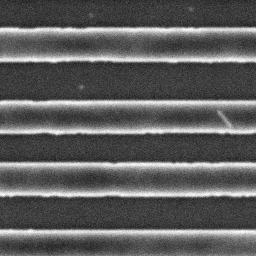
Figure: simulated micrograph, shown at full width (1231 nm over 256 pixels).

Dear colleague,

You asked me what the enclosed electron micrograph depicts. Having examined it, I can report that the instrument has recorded lines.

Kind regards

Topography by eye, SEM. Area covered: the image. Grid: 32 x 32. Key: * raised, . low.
................................
................................
................................
................................
********************************
********************************
********************************
*********..*.*******************
................................
................................
................................
................................
................................
********************************
********************************
********************************
*****.***************......*****
................................
................................
................................
********************************
********************************
********************************
********************************
........*.......................
................................
................................
................................
................................
********************************
********************************
********************************